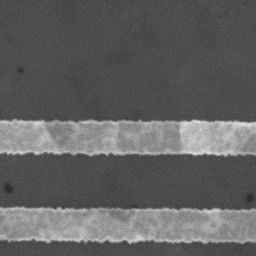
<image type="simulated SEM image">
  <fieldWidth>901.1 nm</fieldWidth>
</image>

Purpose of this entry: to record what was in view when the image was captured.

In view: lines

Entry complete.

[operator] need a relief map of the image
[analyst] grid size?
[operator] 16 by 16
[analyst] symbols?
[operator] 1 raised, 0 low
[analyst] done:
0000000000000000
0000000000000000
0000000000000000
0000000000000000
0000000000000000
0000000000000000
0000000000000000
0000000000000000
1111111111111111
1111111111111111
0000000000000000
0000000000000000
0000000000000000
1111111111111111
1111111111111111
0000000000000000